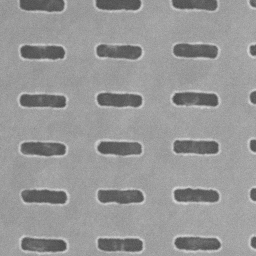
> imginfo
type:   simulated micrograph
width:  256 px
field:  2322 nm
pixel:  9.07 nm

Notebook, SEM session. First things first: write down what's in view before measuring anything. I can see a regular array of holes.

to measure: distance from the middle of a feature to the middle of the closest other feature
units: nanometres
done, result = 437